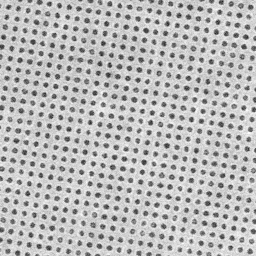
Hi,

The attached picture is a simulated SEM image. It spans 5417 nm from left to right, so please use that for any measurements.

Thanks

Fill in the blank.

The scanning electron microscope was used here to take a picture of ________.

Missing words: a regular array of holes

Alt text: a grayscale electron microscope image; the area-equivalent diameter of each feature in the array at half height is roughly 0.133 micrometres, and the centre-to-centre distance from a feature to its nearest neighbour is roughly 207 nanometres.